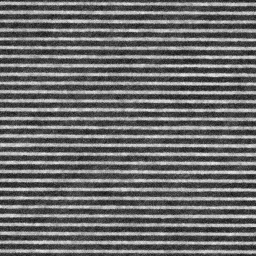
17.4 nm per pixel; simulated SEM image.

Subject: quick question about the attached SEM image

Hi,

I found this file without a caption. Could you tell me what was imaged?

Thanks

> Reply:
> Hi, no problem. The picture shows parallel lines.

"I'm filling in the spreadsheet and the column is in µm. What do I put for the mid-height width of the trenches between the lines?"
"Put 0.116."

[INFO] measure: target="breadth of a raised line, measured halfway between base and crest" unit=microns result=0.0414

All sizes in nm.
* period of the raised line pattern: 154